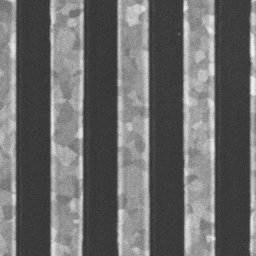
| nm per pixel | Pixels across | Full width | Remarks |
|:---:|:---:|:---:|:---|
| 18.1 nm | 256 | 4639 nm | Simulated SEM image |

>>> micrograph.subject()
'lines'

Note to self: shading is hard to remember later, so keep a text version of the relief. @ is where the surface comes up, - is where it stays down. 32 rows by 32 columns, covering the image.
@@----@@@@-----@@@-----@@@@----@
@@----@@@@-----@@@-----@@@@----@
@@----@@@@-----@@@@----@@@@----@
@@----@@@@-----@@@@----@@@@----@
@@----@@@@-----@@@-----@@@@----@
@@----@@@@-----@@@-----@@@@----@
@@----@@@@-----@@@-----@@@@----@
@@----@@@@-----@@@@----@@@@----@
@@----@@@@-----@@@@----@@@@----@
@@----@@@@-----@@@@----@@@@----@
@@----@@@@-----@@@@----@@@@----@
@@----@@@@-----@@@@----@@@@----@
@@----@@@@-----@@@@----@@@@----@
@@----@@@@-----@@@@----@@@@----@
@@----@@@@-----@@@@----@@@@----@
@@----@@@@-----@@@@----@@@@----@
@@----@@@@-----@@@@----@@@@----@
@@----@@@@-----@@@@----@@@@----@
@@----@@@@-----@@@@----@@@@----@
@@----@@@@-----@@@@----@@@@----@
@@----@@@@-----@@@@----@@@@----@
@@----@@@@-----@@@@----@@@@----@
@@----@@@@-----@@@@----@@@@----@
@@----@@@@-----@@@@----@@@@----@
@@----@@@@-----@@@@----@@@@----@
@@----@@@@-----@@@@----@@@@----@
@@----@@@@-----@@@@----@@@@----@
@@-----@@@-----@@@@----@@@@----@
@@-----@@@-----@@@@----@@@@----@
@@-----@@@-----@@@@----@@@@----@
@@-----@@@-----@@@@----@@@@----@
@@-----@@@-----@@@@----@@@@----@